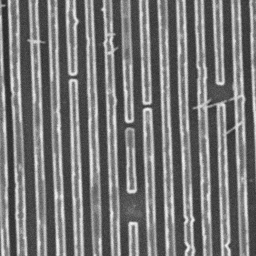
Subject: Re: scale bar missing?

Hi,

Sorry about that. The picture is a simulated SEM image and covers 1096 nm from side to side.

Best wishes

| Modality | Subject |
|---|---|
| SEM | parallel lines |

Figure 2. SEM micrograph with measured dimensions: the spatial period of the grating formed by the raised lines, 79.2 nm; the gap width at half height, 9.37 pixels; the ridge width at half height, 35.8 nm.